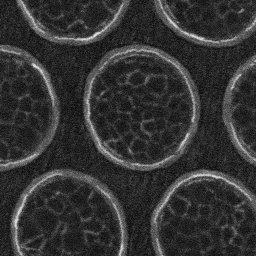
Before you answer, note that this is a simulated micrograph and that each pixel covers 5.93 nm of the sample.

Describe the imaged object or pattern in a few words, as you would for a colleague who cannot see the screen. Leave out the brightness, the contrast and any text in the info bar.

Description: raised bodies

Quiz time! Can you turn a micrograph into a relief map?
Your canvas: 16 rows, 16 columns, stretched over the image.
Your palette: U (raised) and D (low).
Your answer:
DDUUUUUUDDUUUUUU
DDUUUUUDDDDUUUUU
DDDDUDDDDDDDUUUD
UUDDDDDUUUDDDDDD
UUUDDDUUUUUDDDDU
UUUDDDUUUUUUDDUU
UUUDDUUUUUUUDDUU
UUUDDDUUUUUUDDUU
UUUDDDUUUUUUDDDU
UUDDDDDUUUUDDDDU
DDDDDDDDDDDDDDDD
DDUUUUDDDDDUUUUD
DUUUUUUDDDUUUUUU
DUUUUUUDDDUUUUUU
DUUUUUUUDDUUUUUU
DUUUUUUUDDUUUUUU